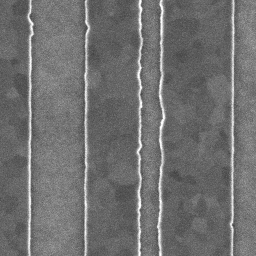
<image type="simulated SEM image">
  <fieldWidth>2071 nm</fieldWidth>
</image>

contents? one or a few lines or trenches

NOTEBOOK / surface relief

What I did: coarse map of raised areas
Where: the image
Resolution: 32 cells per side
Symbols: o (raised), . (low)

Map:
oooo.......ooooooo..ooooooooo...
oooo.......ooooooo..ooooooooo...
oooo.......ooooooo..ooooooooo...
oooo.......ooooooo..ooooooooo...
oooo.......ooooooo..ooooooooo...
oooo.......ooooooo..ooooooooo...
oooo.......ooooooo..ooooooooo...
oooo.......ooooooo..ooooooooo...
oooo.......ooooooo..ooooooooo...
oooo.......oooooo...ooooooooo...
oooo.......ooooooo..ooooooooo...
oooo.......ooooooo..ooooooooo...
oooo.......ooooooo..ooooooooo...
oooo.......ooooooo..ooooooooo...
oooo.......ooooooo..ooooooooo...
oooo.......ooooooo..ooooooooo...
oooo.......ooooooo..ooooooooo...
oooo.......ooooooo..ooooooooo...
oooo.......ooooooo..ooooooooo...
oooo.......oooooo...ooooooooo...
oooo.......oooooo...ooooooooo...
oooo.......ooooooo..ooooooooo...
oooo.......ooooooo..ooooooooo...
oooo.......ooooooo..ooooooooo...
oooo.......oooooo...ooooooooo...
oooo.......ooooooo..ooooooooo...
oooo.......oooooo...ooooooooo...
oooo.......oooooo...ooooooooo...
oooo.......ooooooo..ooooooooo...
oooo.......oooooo...ooooooooo...
oooo.......oooooo...ooooooooo...
oooo.......ooooooo..ooooooooo...